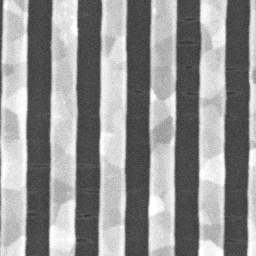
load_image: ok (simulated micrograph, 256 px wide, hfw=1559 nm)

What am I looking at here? wiring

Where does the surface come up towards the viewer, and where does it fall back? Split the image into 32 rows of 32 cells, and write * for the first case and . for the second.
.**....**....***...***...***....
.**....**....***...***...***....
***....**....***...***...***...*
***....**....***...***...***...*
***....**....***...***...***...*
***....**....***...***...***...*
***....**....***...***...***...*
***....**....***...***...***...*
***....**....***...***...***...*
***....**....***...***...***...*
***....**....***...***...***...*
***....**....***...***...***....
***....**....***...***...***...*
***....**....***...***...***...*
***....**....***...***...***...*
***...***....***...***...***...*
***...***....***...***...***...*
***...***....**....***...***...*
***...***....**....***...***...*
***....**....**....***...***...*
***....**....**....***...***...*
***...***....**....***...***...*
***...***....**....***...***...*
***...***....**....***...***...*
***...***....**....***...***...*
***...***....**....***...***...*
***...***....**....***...***...*
***...***....**....***...***...*
***...***....**....***...***...*
***...***....**....***...***...*
***...***....**....***...***...*
***...***....**....***...***...*